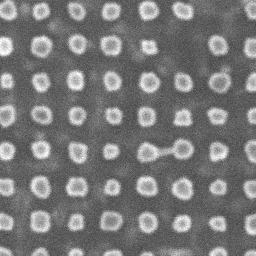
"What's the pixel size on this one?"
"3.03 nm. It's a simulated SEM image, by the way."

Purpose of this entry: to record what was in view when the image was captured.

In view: a regular array of raised bodies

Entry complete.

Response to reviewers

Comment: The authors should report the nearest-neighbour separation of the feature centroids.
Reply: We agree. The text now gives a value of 103 nanometres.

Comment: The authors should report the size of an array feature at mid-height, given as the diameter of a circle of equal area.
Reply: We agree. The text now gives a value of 0.0512 µm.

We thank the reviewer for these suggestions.